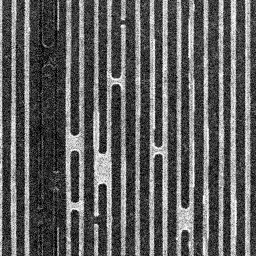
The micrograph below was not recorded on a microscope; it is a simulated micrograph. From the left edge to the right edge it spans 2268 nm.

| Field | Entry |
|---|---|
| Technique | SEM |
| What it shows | parallel lines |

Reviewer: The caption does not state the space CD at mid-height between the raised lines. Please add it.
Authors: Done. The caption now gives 0.0874 micrometres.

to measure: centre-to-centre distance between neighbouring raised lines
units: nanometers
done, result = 122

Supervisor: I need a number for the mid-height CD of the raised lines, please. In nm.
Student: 32.1